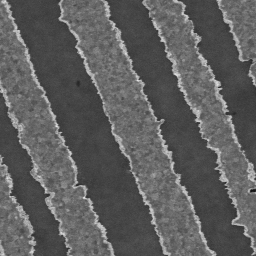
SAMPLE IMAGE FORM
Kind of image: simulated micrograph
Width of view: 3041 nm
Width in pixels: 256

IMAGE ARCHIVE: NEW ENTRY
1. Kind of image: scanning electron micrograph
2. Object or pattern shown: one or a few lines or trenches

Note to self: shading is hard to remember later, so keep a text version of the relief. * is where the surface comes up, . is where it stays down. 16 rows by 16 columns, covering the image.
....***..**...**
*...***...**..**
*....**...**...*
**...***...**..*
**....**...**...
***...***..***..
***...***...**..
.**....***..**..
.***...***...**.
..**....**...**.
..***...***...**
*..**....**...**
*..***...***...*
**.***....**...*
**..**....***..*
**..***...***...